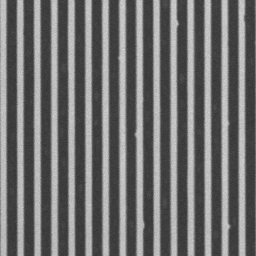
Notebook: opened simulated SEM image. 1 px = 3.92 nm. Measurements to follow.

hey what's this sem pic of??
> parallel lines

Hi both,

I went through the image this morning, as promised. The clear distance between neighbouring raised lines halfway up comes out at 41.1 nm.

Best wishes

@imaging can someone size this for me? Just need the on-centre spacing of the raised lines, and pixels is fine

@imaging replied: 17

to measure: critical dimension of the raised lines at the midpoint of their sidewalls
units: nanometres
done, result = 24